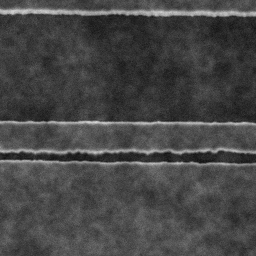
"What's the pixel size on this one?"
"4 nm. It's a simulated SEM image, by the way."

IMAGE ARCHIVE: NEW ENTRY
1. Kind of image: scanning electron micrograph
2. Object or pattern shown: lines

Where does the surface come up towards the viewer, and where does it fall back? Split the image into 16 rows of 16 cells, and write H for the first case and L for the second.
HHHHHHHHHHHHHHHH
LLLLLLLLLLLLLLLL
LLLLLLLLLLLLLLLL
LLLLLLLLLLLLLLLL
LLLLLLLLLLLLLLLL
LLLLLLLLLLLLLLLL
LLLLLLLLLLLLLLLL
LLLLLLLLLLLLLLLL
HHHHHHHHHHHHHHHH
HHHHHHHHHHHHHHHH
HHHHHHHHHHHHHHHH
HHHHHHHHHHHHHHHH
HHHHHHHHHHHHHHHH
HHHHHHHHHHHHHHHH
HHHHHHHHHHHHHHHH
HHHHHHHHHHHHHHHH